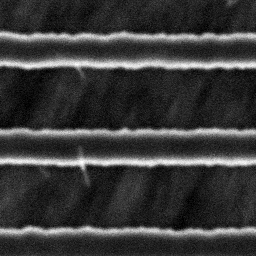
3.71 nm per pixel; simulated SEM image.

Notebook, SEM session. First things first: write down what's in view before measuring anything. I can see lines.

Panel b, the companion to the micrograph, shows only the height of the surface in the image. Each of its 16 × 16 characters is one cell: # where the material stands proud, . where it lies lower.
................
................
################
################
................
................
................
................
################
################
................
................
................
................
################
################